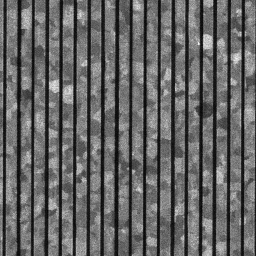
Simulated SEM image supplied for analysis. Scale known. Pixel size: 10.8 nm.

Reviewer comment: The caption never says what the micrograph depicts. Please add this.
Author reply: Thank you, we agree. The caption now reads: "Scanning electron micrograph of parallel lines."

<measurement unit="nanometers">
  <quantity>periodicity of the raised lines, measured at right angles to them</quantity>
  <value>151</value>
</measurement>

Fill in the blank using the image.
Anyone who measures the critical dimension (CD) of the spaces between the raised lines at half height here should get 43.3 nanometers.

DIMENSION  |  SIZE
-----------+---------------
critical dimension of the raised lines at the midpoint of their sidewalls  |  9.87 px